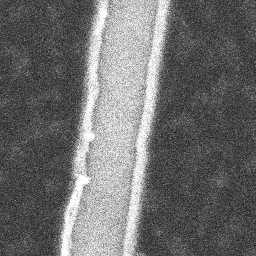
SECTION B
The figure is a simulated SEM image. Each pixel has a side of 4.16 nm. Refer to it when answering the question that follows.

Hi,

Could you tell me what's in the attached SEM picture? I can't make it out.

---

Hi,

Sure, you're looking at one or a few lines or trenches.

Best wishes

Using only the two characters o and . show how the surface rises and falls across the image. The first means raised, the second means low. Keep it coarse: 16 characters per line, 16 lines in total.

ooooooo...oooooo
oooooo....oooooo
oooooo....oooooo
oooooo....oooooo
oooooo...ooooooo
oooooo...ooooooo
oooooo...ooooooo
oooooo...ooooooo
oooooo...ooooooo
ooooo....ooooooo
ooooo....ooooooo
ooooo...oooooooo
ooooo...oooooooo
ooooo...oooooooo
oooo....oooooooo
oooo....oooooooo